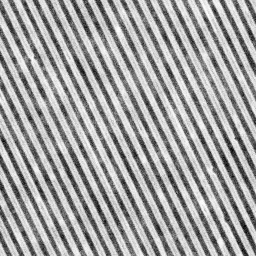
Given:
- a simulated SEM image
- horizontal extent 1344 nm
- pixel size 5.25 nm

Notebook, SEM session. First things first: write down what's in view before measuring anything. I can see parallel lines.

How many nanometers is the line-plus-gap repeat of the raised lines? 58.7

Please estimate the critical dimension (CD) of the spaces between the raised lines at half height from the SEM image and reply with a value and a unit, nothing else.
31.3 nm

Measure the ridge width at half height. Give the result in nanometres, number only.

28.4